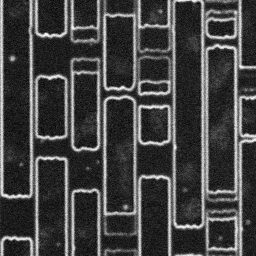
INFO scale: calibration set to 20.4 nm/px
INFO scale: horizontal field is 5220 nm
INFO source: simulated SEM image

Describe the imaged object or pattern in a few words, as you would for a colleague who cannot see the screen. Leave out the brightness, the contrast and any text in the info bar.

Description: parallel lines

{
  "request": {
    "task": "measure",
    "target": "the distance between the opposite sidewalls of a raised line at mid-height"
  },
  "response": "120 nm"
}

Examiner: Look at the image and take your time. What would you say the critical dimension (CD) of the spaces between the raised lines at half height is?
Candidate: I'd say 581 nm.